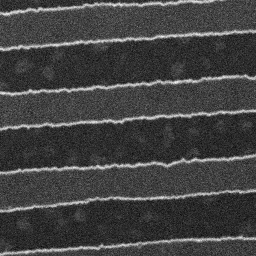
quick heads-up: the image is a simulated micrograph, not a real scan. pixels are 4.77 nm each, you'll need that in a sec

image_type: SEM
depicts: one or a few lines or trenches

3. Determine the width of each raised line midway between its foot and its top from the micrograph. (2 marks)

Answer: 167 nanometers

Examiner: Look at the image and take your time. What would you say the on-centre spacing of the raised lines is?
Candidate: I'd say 0.382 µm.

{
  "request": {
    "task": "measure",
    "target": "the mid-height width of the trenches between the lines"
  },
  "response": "214 nm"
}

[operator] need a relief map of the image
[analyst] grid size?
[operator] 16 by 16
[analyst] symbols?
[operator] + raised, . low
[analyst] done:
....++++++++++++
++++++++++++++++
++++++++........
................
................
......++++++++++
++++++++++++++++
++++++++........
................
................
....++++++++++++
++++++++++++++++
++++++..........
................
................
.....+++++++++++